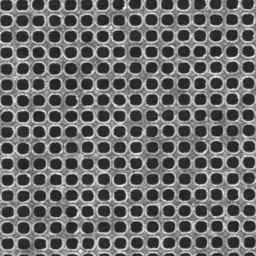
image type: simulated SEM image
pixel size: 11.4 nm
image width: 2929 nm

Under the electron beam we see a regular array of holes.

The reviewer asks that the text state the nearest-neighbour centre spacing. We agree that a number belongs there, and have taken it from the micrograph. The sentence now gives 179 nm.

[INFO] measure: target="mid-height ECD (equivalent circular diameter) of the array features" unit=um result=0.148